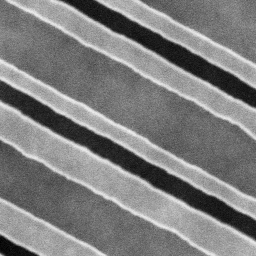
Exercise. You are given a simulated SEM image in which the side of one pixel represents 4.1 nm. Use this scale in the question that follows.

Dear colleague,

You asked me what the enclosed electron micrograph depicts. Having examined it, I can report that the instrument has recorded lines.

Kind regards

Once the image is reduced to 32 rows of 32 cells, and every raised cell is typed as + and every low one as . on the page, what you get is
..++++++.....+++++..............
....++++++.....+++++............
.....+++++++.....+++++..........
.......++++++......++++.........
.........++++++.....+++++.......
..........+++++++.....+++++.....
.............++++++.....+++++...
...............++++++.....+++++.
++..............++++++......++++
++++..............++++++......++
.++++...............++++++.....+
...++++...............++++++....
.....++++...............++++++..
++....+++++...............++++++
+++.....+++++..............+++++
+++++.....+++++...............++
+++++++.....++++...............+
++++++++......++++..............
..+++++++++.....++++............
...+++++++++.....+++++..........
......++++++++.....++++.........
.......+++++++++.....+++++......
.........+++++++++.....++++.....
...........++++++++......++++...
.............++++++++......++++.
+..............++++++++.....++++
+++.............+++++++++.....++
+++++..............++++++++.....
+++++++.............+++++++++...
+++++++++.............+++++++++.
..+++++++++.............++++++++
....++++++++..............++++++